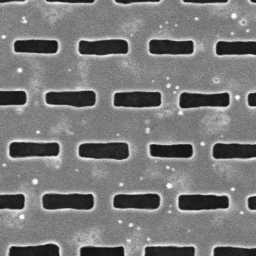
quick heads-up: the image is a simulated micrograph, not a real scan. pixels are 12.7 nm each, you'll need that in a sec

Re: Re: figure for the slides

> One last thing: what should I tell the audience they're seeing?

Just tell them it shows a regular array of holes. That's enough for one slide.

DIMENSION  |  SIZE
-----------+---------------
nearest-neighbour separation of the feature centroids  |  769 nm